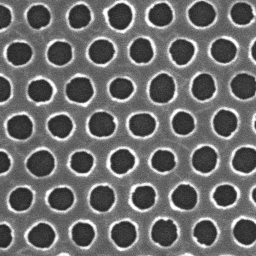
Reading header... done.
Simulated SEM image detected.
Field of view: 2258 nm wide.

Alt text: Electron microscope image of a regular array of holes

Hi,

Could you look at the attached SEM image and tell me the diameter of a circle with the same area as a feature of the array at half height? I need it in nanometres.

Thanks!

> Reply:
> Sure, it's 228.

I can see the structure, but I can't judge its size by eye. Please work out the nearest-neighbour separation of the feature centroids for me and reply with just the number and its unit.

40.5 px